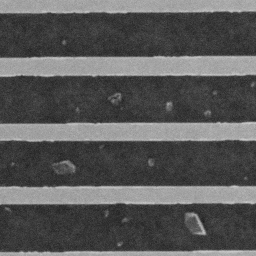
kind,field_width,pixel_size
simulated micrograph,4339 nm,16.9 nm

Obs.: lines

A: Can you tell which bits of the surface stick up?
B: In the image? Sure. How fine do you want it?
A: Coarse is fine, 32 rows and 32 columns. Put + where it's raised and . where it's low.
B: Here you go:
++++++++++++++++++++++++++++++++
++++++++++++.+++................
................................
................................
................................
................................
................................
++++++++++++++++++++++++++++++++
++++++++++++++++++++++++++++++++
................................
................................
................................
................................
................................
................................
........++++++++++++++++++++++++
++++++++++++++++++++++++++++++++
++++++++++++++++++++++++++++..++
................................
................................
.......++.......................
................................
................................
++++++++++++++++++++++++++++++++
++++++++++++++++++++++++++++++++
+...............................
................................
.......................++.......
........................+.......
................................
................................
........................++++++++